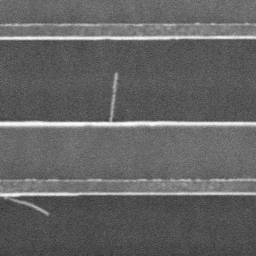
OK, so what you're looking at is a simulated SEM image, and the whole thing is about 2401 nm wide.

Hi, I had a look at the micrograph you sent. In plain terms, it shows lines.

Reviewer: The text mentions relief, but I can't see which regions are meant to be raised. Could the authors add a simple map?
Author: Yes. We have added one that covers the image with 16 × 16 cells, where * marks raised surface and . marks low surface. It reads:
****************
****************
................
................
................
................
................
................
****************
****************
****************
****************
................
................
................
................